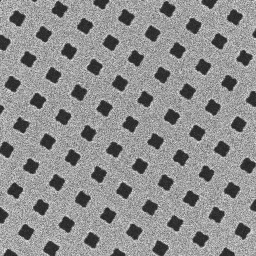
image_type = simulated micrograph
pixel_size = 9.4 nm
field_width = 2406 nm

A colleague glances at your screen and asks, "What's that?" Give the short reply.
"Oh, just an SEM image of a regular array of holes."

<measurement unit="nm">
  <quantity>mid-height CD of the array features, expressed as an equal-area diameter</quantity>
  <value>136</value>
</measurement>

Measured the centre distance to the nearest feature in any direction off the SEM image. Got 275 nanometers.